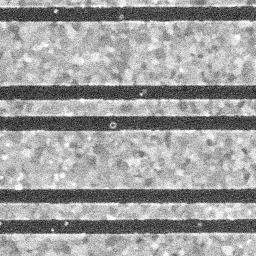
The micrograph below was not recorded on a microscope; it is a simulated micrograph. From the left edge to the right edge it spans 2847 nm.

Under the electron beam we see lines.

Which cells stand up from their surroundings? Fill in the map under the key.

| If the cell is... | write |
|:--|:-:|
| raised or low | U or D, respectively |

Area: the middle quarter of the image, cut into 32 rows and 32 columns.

UUUUUUUUUUUUUUUUUUUUUUUUUUUUUUUU
UUUUUUUUUUUUUUUUUUUUUUUUUUUUUUUU
UUUUUUUUUUUUUUUUUUUUUUUUUUUUUUUU
UUUUUUUUUUUUUUUUUUUUUUUUUUUUUUUU
UUUUUUUUUUUUUUUUUUUUUUUUUUUUUUUU
DDDDDDDDDDDDDDDDDDDDDDDDDDDDDDDD
DDDDDDDDDDDDDDDDDDDDDDDDDDDDDDDD
DDDDDDDDDDDDDDDDDDDDDDDDDDDDDDDD
DDDDDDDDDDDDDDDDDDDDDDDDDDDDDDDD
UUUUUUUUUUUUUUUUUUUUUUUUUUUUUUUU
UUUUUUUUUUUUUUUUUUUUUUUUUUUUUUUU
UUUUUUUUUUUUUUUUUUUUUUUUUUUUUUUU
UUUUUUUUUUUUUUUUUUUUUUUUUUUUUUUU
DDDDDDDDDDDDDDDDDDDDDDDDDDDDDDDD
DDDDDDDDDDDDDDDDDDDDDDDDDDDDDDDD
DDDDDDDDDDDDDDDDDDDDDDDDDDDDDDDD
DDDDDDDDDDDDDDDDDDDDDDDDDDDDDDDD
UUUUUUUUUUUUUUUUUUUUUUUUUUUUUUUU
UUUUUUUUUUUUUUUUUUUUUUUUUUUUUUUU
UUUUUUUUUUUUUUUUUUUUUUUUUUUUUUUU
UUUUUUUUUUUUUUUUUUUUUUUUUUUUUUUU
UUUUUUUUUUUUUUUUUUUUUUUUUUUUUUUU
UUUUUUUUUUUUUUUUUUUUUUUUUUUUUUUU
UUUUUUUUUUUUUUUUUUUUUUUUUUUUUUUU
UUUUUUUUUUUUUUUUUUUUUUUUUUUUUUUU
UUUUUUUUUUUUUUUUUUUUUUUUUUUUUUUU
UUUUUUUUUUUUUUUUUUUUUUUUUUUUUUUU
UUUUUUUUUUUUUUUUUUUUUUUUUUUUUUUU
UUUUUUUUUUUUUUUUUUUUUUUUUUUUUUUU
UUUUUUUUUUUUUUUUUUUUUUUUUUUUUUUU
UUUUUUUUUUUUUUUUUUUUUUUUUUUUUUUU
DDDDDDDDDDDDDDDDDDDDDDDDDDDDDDDD